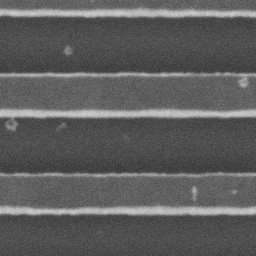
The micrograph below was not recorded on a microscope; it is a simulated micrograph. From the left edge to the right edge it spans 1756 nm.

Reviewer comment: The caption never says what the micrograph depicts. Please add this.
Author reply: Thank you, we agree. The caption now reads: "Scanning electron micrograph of lines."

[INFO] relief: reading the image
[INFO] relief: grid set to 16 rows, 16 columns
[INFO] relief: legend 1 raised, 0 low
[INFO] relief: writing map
1111111111111111
0000000000000000
0000000000000000
0000000000000000
0000000000000000
1111111111111111
1111111111111111
0000000000000000
0000000000000000
0000000000000000
0000000000000000
1111111111111111
1111111111111111
0000000000000000
0000000000000000
0000000000000000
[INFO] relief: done